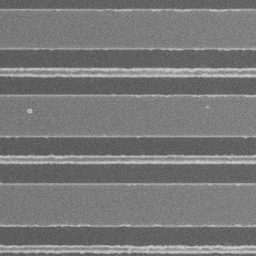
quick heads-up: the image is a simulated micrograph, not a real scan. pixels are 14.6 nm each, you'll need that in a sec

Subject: lines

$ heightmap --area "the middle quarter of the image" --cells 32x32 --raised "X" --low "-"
--------------------------------
XXXXXXXXXXXXXXXXXXXXXXXXXXXXXXXX
XXXXXXXXXXXXXXXXXXXXXXXXXXXXXXXX
--------------------------------
--------------------------------
--------------------------------
--------------------------------
--------------------------------
XXXXXXXXXXXXXXXXXXXXXXXXXXXXXXXX
XXXXXXXXXXXXXXXXXXXXXXXXXXXXXXXX
XXXXXXXXXXXXXXXXXXXXXXXXXXXXXXXX
XXXXXXXXXXXXXXXXXXXXXXXXXXXXXXXX
XXXXXXXXXXXXXXXXXXXXXXXXXXXXXXXX
XXXXXXXXXXXXXXXXXXXXXXXXXXXXXXXX
XXXXXXXXXXXXXXXXXXXXXXXXXXXXXXXX
XXXXXXXXXXXXXXXXXXXXXXXXXXXXXXXX
XXXXXXXXXXXXXXXXXXXXXXXXXXXXXXXX
XXXXXXXXXXXXXXXXXXXXXXXXXXXXXXXX
--------------------------------
--------------------------------
--------------------------------
--------------------------------
--------------------------------
XXXXXXXXXXXXXXXXXXXXXXXXXXXXXXXX
XXXXXXXXXXXXXXXXXXXXXXXXXXXXXXXX
--------------------------------
--------------------------------
--------------------------------
--------------------------------
--------------------------------
XXXXXXXXXXXXXXXXXXXXXXXXXXXXXXXX
XXXXXXXXXXXXXXXXXXXXXXXXXXXXXXXX